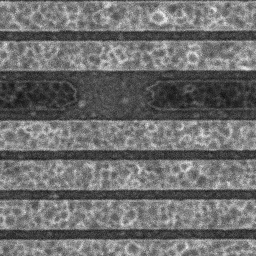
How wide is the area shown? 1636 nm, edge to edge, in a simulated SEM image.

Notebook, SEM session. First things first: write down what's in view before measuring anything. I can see parallel lines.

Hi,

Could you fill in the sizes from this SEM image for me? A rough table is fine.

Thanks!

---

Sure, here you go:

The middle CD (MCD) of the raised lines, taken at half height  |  29 px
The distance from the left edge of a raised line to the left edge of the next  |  0.254 um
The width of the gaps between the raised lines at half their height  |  11.4 pixels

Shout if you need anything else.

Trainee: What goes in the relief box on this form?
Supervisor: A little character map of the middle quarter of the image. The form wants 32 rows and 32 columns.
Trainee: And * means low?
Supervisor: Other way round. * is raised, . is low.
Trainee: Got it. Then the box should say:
********************************
...*.......****.*...............
................................
................................
*.......................********
**....................**********
***..................***********
***...................**********
***...................**********
**....................**********
......................**********
................................
................................
................................
********************************
********************************
********************************
********************************
********************************
********************************
********************************
................................
................................
................................
********************************
*****************************...
******************************.*
********************************
********************************
********************************
********************************
................................